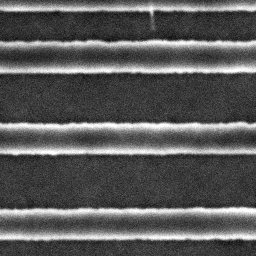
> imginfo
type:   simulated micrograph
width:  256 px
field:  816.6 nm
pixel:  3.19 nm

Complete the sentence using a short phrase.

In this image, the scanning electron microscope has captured lines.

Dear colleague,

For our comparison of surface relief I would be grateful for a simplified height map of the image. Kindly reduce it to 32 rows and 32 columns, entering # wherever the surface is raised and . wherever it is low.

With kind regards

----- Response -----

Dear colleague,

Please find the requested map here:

################################
................................
................................
................................
................................
################################
################################
################################
################################
................................
................................
................................
................................
................................
................................
...#......#.###...#.#...#...###.
################################
################################
################################
................................
................................
................................
................................
................................
................................
................................
################################
################################
################################
################################
................................
................................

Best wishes